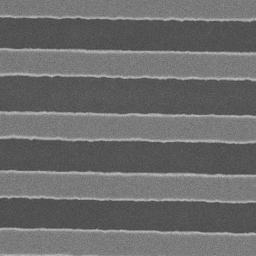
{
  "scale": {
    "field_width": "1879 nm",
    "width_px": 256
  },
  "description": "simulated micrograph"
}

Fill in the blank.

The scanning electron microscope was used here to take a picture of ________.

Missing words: lines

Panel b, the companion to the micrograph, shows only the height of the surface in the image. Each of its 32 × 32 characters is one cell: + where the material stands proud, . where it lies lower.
++++++++++++++++++++++++++++++++
++++++++++++++++++++++++++++++++
....................+.+.++++++++
................................
................................
................................
++++++++++++++++++++++++........
++++++++++++++++++++++++++++++++
++++++++++++++++++++++++++++++++
....+++.++++++++++++++++++++++++
................................
................................
................................
................................
++++++++++++++++++++++++++++++++
++++++++++++++++++++++++++++++++
++++++++++++++++++++++++++++++++
........++++++++++++++++++++++++
................................
................................
................................
+++++++.++......................
++++++++++++++++++++++++++++++++
++++++++++++++++++++++++++++++++
++++++++++++++++++++++++++++++++
................................
................................
................................
................................
++++++++++++++++++++++++++++++++
++++++++++++++++++++++++++++++++
++++++++++++++++++++++++++++++++